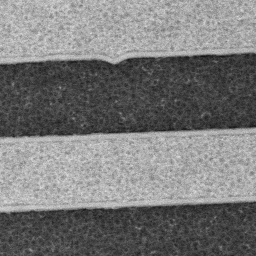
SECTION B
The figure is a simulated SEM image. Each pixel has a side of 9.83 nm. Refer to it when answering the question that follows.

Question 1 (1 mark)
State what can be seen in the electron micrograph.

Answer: one or a few lines or trenches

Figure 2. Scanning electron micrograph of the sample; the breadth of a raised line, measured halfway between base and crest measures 659 nm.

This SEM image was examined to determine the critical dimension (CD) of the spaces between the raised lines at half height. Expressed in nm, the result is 796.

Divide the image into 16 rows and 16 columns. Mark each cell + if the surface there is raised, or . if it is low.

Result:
++++++++++++++++
++++++++++++++++
++++++++++++++++
++++++++........
................
................
................
................
........++++++++
++++++++++++++++
++++++++++++++++
++++++++++++++++
++++++++++++....
................
................
................